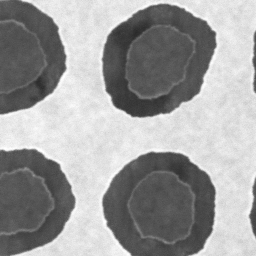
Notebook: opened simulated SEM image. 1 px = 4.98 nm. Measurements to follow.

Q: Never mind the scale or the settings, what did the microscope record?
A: ring-shaped grooves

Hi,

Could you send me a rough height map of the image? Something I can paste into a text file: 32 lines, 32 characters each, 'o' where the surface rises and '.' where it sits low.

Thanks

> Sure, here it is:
....ooooooooooooooo...oooooooooo
.....oooooooooooo.......oooooooo
.......ooooooooo..........oooooo
ooo....ooooooo.....ooo....oooooo
oooo....ooooo....ooooooo...ooooo
ooooo...ooooo...oooooooo...ooooo
ooooo...ooooo...oooooooo...ooooo
oooooo..ooooo...oooooooo..ooooo.
ooooo...ooooo...ooooooo...oooooo
ooooo...ooooo...ooooooo...oooooo
oooo...oooooo...oooooo...ooooooo
o......oooooo....oooo....ooooooo
.....ooooooooo..........oooooooo
....oooooooooo........oooooooooo
oooooooooooooooo....oooooooooooo
oooooooooooooooooooooooooooooooo
oooooooooooooooooooooooooooooooo
oooooooooooooooooooooooooooooooo
ooo.oooooooooooooooooooooooooooo
......ooooooooooo......ooooooooo
.......ooooooooo........oooooooo
..oo....ooooooo....oo.....oooooo
ooooo....ooooo....ooooo...oooooo
oooooo...oooo....ooooooo...ooooo
oooooo...oooo...oooooooo...ooooo
ooooooo..oooo...oooooooo...oooo.
oooooo...oooo...oooooooo...oooo.
ooooo....oooo....ooooooo...oooo.
ooooo...ooooo....ooooooo...oooo.
.......ooooooo....ooooo...oooooo
......ooooooooo...........oooooo
...ooooooooooooo.........ooooooo